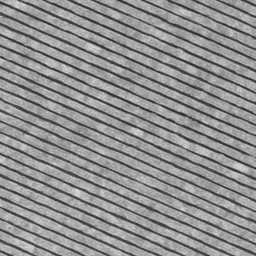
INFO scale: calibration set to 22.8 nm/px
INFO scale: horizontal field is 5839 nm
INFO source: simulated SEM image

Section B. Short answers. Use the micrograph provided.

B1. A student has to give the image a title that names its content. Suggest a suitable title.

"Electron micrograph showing parallel lines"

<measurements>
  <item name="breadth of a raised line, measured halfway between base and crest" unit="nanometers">164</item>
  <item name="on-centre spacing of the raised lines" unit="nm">226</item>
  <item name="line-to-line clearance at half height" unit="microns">0.0627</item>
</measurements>